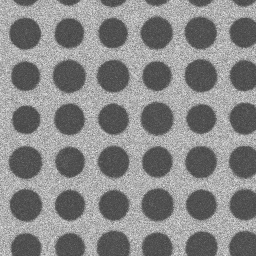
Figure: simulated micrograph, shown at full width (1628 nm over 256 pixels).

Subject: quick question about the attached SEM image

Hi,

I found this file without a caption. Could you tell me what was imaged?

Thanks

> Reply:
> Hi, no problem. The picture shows a regular array of holes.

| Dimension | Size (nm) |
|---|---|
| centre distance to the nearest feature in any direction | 272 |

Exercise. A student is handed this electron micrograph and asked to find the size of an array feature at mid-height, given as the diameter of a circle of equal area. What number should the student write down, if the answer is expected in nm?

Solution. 192